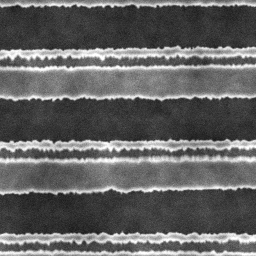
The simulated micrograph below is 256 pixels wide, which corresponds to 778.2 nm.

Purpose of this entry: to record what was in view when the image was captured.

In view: lines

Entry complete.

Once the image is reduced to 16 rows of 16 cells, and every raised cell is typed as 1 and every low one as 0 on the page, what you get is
0000000000000000
0000000000000000
0000000000000000
1111111111111111
1111111111111111
1111111111111111
0000000000000000
0000000000000000
0000000000000000
1111111111111111
1111111111111111
1111111111111111
0000000000000000
0000000000000000
0000000000000000
1111111111111111